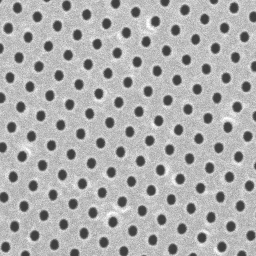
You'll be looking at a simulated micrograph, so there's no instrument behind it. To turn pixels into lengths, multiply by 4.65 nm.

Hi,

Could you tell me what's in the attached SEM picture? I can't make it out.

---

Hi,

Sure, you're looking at a regular array of holes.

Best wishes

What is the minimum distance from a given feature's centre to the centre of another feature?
101 nm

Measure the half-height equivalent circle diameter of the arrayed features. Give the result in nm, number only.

45.8